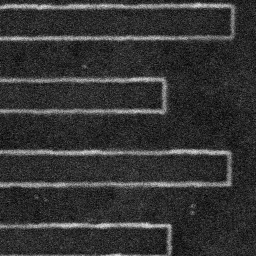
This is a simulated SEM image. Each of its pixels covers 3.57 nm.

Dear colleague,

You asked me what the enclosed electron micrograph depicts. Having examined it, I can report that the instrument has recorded one or a few lines or trenches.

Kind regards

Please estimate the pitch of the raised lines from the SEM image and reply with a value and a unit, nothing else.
0.261 um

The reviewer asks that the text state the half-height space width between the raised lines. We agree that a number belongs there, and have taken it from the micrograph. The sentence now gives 106 nm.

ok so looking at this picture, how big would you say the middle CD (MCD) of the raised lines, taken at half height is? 156 nanometers